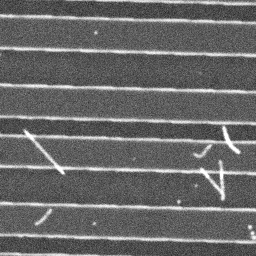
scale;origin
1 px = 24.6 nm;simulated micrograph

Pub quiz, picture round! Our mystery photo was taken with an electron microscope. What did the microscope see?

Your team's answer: lines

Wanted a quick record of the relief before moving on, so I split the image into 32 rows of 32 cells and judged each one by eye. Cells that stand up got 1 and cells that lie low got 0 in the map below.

00000000000000000000000000001111
00000000000000000000000000000000
11111111111111111111111100000000
11111111111111111111111111111111
11111111111111111111111111111111
11111111111111111111111111111111
00000000000000111111111111111111
00000000000000000000000000000000
00000000000000000000000000000000
00000000000000000000000000000000
00000000000000000000000000000000
11111111111111111111111111111110
11111111111111111111111111111111
11111111111111111111111111111111
11111111111111111111111111111111
00000000000000000000000000000001
00000000000000000000000000000000
11111111111111111111000000001000
11111111111111111111111111111111
11111111111111111111111111111111
11111111111111111111111111111111
00000000000000000000000111111111
00000000000000000000000000000000
00000000000000000000000000000000
00000000000000000000000000000000
11111000000000000000000000000000
11111111111111111111111111111111
11111111111111111111111111111111
11111111111111111111111111111111
00111111111111111111111111111111
00000000000000000000000000000000
00000000000000000000000000000000